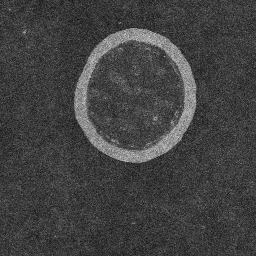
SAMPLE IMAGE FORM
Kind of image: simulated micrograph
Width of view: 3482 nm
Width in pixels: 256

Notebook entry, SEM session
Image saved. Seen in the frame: raised bodies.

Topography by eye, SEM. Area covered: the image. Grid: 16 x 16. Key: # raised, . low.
................
................
.......###......
......#####.....
.....#######....
.....#######....
.....#######....
.....#######....
......#####.....
.......###......
................
................
................
................
................
................